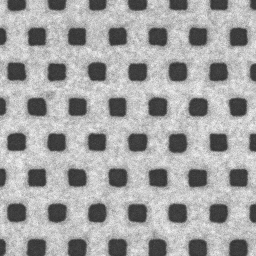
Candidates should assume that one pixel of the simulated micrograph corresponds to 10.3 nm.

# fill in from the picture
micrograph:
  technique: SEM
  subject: a regular array of holes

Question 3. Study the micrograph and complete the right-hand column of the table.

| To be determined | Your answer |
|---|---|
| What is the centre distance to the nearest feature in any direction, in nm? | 411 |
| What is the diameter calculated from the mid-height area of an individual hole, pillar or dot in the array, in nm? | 209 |